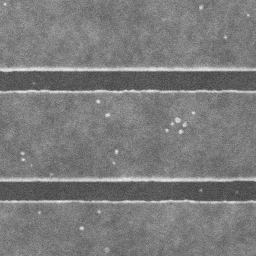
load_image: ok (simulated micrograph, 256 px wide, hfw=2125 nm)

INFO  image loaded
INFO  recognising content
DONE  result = lines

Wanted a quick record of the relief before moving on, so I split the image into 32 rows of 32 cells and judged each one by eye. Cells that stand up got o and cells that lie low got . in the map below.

oooooooooooooooooooooooooooooooo
oooooooooooooooooooooooooooooooo
oooooooooooooooooooooooooooooooo
oooooooooooooooooooooooooooooooo
oooooooooooooooooooooooooooooooo
oooooooooooooooooooooooooooooooo
oooooooooooooooooooooooooooooooo
oooooooooooooooooooooooooooooooo
oooooooooooooooooooooooooooooooo
................................
................................
.ooooooooooooooooooooooooooooooo
oooooooooooooooooooooooooooooooo
oooooooooooooooooooooooooooooooo
oooooooooooooooooooooooooooooooo
oooooooooooooooooooooooooooooooo
oooooooooooooooooooooooooooooooo
oooooooooooooooooooooooooooooooo
oooooooooooooooooooooooooooooooo
oooooooooooooooooooooooooooooooo
oooooooooooooooooooooooooooooooo
oooooooooooooooooooooooooooooooo
oooooooooooooooooooooooooooooooo
................................
................................
oooooooooooooooooooooooooooooooo
oooooooooooooooooooooooooooooooo
oooooooooooooooooooooooooooooooo
oooooooooooooooooooooooooooooooo
oooooooooooooooooooooooooooooooo
oooooooooooooooooooooooooooooooo
oooooooooooooooooooooooooooooooo